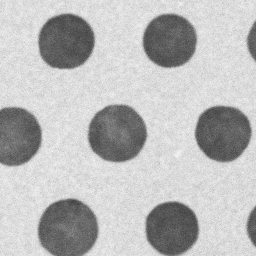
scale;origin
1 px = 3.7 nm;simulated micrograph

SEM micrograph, holes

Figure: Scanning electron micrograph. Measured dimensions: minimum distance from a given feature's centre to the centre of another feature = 386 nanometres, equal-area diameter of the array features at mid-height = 209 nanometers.